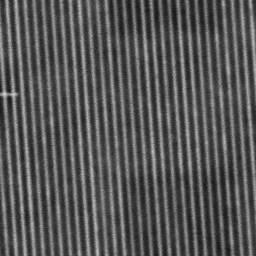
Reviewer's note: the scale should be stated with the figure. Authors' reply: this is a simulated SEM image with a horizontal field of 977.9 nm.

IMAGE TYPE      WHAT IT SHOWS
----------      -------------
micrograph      parallel lines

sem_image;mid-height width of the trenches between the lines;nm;24.3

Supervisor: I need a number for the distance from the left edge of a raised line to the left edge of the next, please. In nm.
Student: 34.4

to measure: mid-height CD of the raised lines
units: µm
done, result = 0.0105